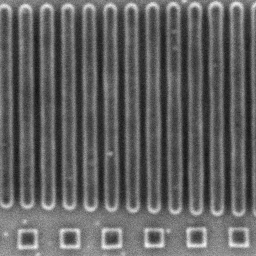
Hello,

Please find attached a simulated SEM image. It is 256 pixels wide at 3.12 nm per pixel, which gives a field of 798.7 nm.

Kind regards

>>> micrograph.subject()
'groups of lines, slits or small figures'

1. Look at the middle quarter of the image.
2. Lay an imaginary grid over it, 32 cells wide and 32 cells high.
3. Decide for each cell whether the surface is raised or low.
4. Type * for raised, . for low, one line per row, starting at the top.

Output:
***..***..***...**...***..***..*
***..***..***...**...***..***..*
***..***..***...**...***..***..*
***..***..***...**...***..***..*
***..***..***...**...***..***..*
***..***..***...**...***..***..*
***..***..***...**...***..***..*
***..***..***...**...***..***..*
***..***..***...**...***..***..*
***..***..***...**...***..***..*
***..***..***...**...***..***..*
***..***..***...**...***..***..*
***..***..***...***..***..***..*
***..***..***...***..***..***..*
***..***..***...***..***..***..*
***..***..***...***..***..***..*
***..***..***...***..***..***..*
***..***..***...***..***..***..*
***..***..***...***..***..***..*
***..***..***...***..***..***..*
***..***..***...***..***..***..*
***..***..***...***..***..***..*
***..***..***...***..***..***..*
***..***..***...***..***..***..*
***..***..***...***..***..***..*
***..***..***...***..***..***..*
***..***..***...***..***..***..*
***..***..***...***..***..***..*
***..***..***...***..***..***..*
***..***..***...***..***..***..*
***..***..***...***..***..***..*
***..***..***...***..***..***..*